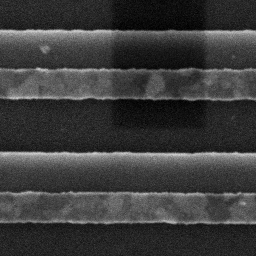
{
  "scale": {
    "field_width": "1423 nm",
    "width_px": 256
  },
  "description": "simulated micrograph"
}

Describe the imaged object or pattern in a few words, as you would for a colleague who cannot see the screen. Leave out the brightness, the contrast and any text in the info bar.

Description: lines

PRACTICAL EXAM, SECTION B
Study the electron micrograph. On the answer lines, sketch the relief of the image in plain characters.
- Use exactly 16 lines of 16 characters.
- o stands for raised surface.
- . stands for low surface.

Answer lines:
................
................
oooooooooooooooo
oooooooooooooooo
oooooooooooooooo
oooooooooooooooo
................
................
................
................
oooooooooooooooo
oooooooooooooooo
oooooooooooooooo
oooooooooooooooo
................
................